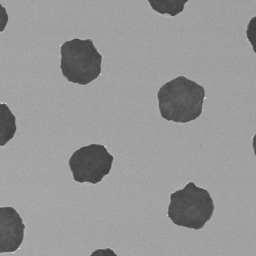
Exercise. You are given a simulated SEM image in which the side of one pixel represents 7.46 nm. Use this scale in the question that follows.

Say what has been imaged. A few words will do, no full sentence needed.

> holes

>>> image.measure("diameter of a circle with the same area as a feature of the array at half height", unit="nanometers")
329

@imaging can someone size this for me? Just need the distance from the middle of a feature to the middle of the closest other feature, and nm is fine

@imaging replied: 784